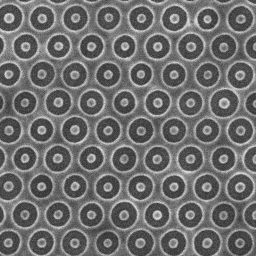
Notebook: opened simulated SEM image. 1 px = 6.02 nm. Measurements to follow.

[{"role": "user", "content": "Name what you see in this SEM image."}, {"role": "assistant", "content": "a regular array of ring-shaped grooves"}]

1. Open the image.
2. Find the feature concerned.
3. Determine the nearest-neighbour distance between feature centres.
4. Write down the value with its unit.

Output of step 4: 194 nanometers